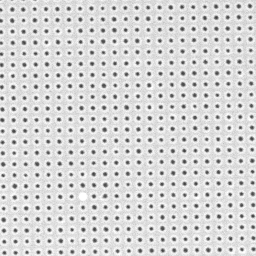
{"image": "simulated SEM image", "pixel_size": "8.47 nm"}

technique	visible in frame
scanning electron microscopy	a regular array of holes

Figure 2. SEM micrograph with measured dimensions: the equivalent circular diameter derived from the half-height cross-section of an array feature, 0.0405 micrometres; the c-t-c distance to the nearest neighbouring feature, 92.4 nanometres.